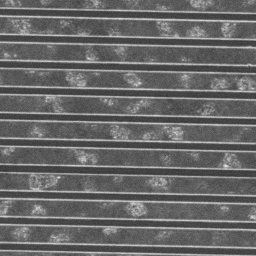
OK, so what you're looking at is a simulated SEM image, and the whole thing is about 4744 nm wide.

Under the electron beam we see parallel lines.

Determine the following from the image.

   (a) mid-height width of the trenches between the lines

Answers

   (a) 137 nm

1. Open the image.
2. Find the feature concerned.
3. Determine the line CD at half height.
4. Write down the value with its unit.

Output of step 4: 336 nm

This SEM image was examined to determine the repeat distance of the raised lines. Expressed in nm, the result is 482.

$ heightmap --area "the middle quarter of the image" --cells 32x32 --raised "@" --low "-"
--------------------------------
@@------------------------------
@@@@@@@@@@@@@@@@@@@@@@@@@@@@@@@@
@@@@@@@@@@@@@@@@@@@@@@@@@@@@@@@@
@@@@@@@@@@@@@@@@@@@@@@@@@@@@@@@@
@@@@@@@@@@@@@@@@@@@@@@@@@@@@@@@@
--------------------------------
--------------------------------
@@@@@@@@@@@@@@@@@@@@@@----------
@@@@@@@@@@@@@@@@@@@@@@@@@@@@@@@@
@@@@@@@@@@@@@@@@@@@@@@@@@@@@@@@@
@@@@@@@@@@@@@@@@@@@@@@@@@@@@@@@@
-------@@@@@@@@@@@@@@@@@@@@@@@@@
--------------------------------
@@@@@---------------------------
@@@@@@@@@@@@@@@@@@@@@@@@@@@@@@@@
@@@@@@@@@@@@@@@@@@@@@@@@@@@@@@@@
@@@@@@@@@@@@@@@@@@@@@@@@@@@@@@@@
@@@@@@@@@@@@@@@@@@@@@@@@@@@@@@@@
--------------------------------
--------------------------------
@@@@@@@@@@@@@@@@@@@@@@@@--------
@@@@@@@@@@@@@@@@@@@@@@@@@@@@@@@@
@@@@@@@@@@@@@@@@@@@@@@@@@@@@@@@@
@@@@@@@@@@@@@@@@@@@@@@@@@@@@@@@@
----------@@@@@@@@@@@@@@@@@@@@@@
--------------------------------
--------------------------------
@@@@@@@@@@@@@@@@@@@@@@@@@@@@@@@@
@@@@@@@@@@@@@@@@@@@@@@@@@@@@@@@@
@@@@@@@@@@@@@@@@@@@@@@@@@@@@@@@@
@@@@@@@@@@@@@@@@@@@@@@@@@@@@@@@@